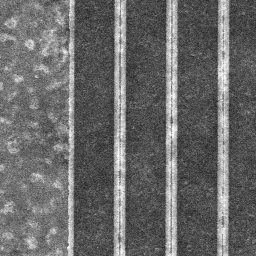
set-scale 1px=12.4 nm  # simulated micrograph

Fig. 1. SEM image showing parallel lines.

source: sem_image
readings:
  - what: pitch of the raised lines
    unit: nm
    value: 640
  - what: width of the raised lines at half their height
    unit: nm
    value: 83.6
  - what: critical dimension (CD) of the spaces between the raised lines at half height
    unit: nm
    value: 564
